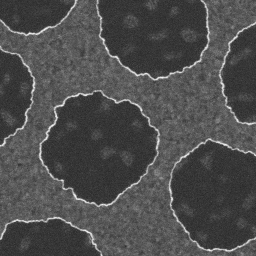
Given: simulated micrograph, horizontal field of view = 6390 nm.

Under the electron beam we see holes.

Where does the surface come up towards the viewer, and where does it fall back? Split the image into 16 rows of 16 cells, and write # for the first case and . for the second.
....##.......###
....##.......###
######.......##.
.######......#..
..######...###..
..############..
..##....######..
..#......######.
.##.......######
###.......##...#
###......##.....
####....###.....
#####..####.....
###########.....
.....#######....
......#######..#